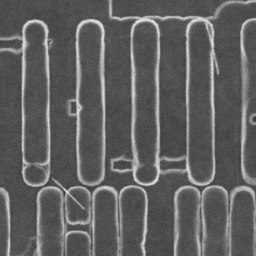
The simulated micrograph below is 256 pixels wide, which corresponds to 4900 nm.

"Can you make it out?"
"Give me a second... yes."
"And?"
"wiring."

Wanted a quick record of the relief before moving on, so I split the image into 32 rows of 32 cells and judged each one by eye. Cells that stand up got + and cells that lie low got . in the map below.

................................
................................
..................+............+
...+++....+++....+++....+++...++
...+++....+++...++++...++++...++
...+++....+++...++++...++++...++
...+++....+++...++++...++++...++
...+++....+++....+++...++++...++
...+++....+++....+++....+++....+
...+++....+++....+++...++++....+
...+++....+++....+++...++++....+
...+++....+++....+++...++++....+
...+++....+++....+++...++++....+
...+++....+++....+++...++++....+
...+++....+++....+++...++++...++
...+++....+++....+++...++++...++
...+++....+++....+++...++++...++
...+++....+++....+++...++++...++
...+++....+++....+++...++++...++
...+++....+++....+++...++++...++
...+++....+++....+++...++++...++
...+++....+++....+++....+++...++
...+++....+++....+++....+++....+
......+..+...+..++.....+..++..+.
+....+++++++++++++....++++++++++
+....+++++++++++++....++++++++++
+....+++++++++++++....++++++++++
+....+++++++++++++....++++++++++
+....+++....++++++....++++++++++
+....+++++++++++++....++++++++++
+....+++++++++++++....++++++++++
+....+++++++++++++....++++++++++